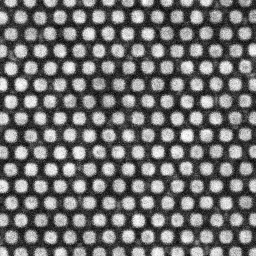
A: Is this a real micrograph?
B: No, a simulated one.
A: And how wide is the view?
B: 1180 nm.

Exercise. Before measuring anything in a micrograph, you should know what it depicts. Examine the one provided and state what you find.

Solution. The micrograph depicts a regular array of raised bodies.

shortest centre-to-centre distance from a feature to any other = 87.6 nanometres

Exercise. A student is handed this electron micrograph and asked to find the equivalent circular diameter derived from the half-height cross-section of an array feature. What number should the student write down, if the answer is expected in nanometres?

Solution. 57.7